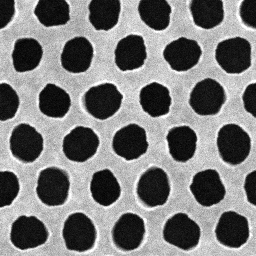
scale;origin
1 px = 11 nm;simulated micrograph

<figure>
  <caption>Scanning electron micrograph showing a regular array of holes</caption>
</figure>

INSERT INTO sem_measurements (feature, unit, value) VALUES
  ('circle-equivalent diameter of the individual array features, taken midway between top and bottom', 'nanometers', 396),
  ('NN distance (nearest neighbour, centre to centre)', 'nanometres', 550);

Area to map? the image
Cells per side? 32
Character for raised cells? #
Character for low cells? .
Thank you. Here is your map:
..###....##....##....###....##..
..##.....##....##....###....##..
.####....##....###...###....##..
############..#####..####..#####
################..##############
##...###...####...###....##....#
##...###....##....##.....##....#
##...###...###....###....##....#
##..####...####..####...####...#
################################
.#####.######.#####.#####...###.
..###...###....###...###....##..
..###....#.....##....###....##..
..###....##....###...###....###.
..####..####..#####.############
################.###########.###
#....####...###...###...###....#
#....###....##....###....##....#
#....###....##.....##....##....#
##...###....###...####..###....#
#############################.##
.####...####..####...####..####.
..###....##....##....###....###.
..###....##....##....###....###.
..###....###...##....###....###.
.#####..####..####..#####..#####
############################.###
##...###...####...###...###....#
#.....##....##....##.....##....#
#.....##....##....##.....##....#
##...###....##...####....###...#
################################